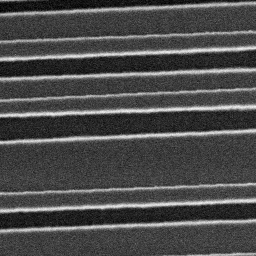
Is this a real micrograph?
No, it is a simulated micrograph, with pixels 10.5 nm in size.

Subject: lines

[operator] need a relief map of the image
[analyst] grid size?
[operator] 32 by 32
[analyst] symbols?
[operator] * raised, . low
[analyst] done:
.............................***
........************************
********************************
********************************
********************************
********************************
**********************..........
................................
................................
............********************
********************************
********************************
********************************
***************************.....
................................
................................
.............................***
........************************
********************************
********************************
********************************
********************************
********************************
********************************
********************************
**********************..........
................................
................................
..........**********************
********************************
********************************
********************************